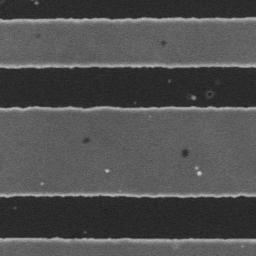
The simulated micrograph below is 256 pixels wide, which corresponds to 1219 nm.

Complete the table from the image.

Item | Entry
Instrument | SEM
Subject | lines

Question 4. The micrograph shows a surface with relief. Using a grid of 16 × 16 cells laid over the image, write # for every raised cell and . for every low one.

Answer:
................
################
################
################
................
................
................
################
################
################
################
################
................
................
................
################